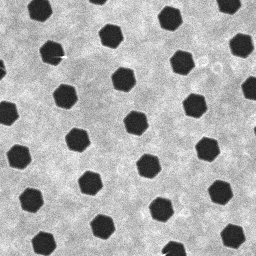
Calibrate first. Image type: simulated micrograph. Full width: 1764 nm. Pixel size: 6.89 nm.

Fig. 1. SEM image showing a regular array of holes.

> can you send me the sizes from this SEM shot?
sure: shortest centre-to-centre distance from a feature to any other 0.31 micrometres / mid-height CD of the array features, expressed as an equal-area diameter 159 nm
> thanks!